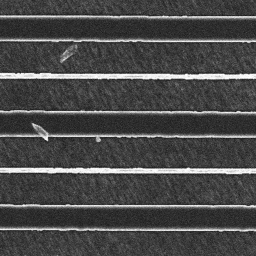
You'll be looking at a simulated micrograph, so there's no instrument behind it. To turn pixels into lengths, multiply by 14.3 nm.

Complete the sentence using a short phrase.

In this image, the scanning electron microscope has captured lines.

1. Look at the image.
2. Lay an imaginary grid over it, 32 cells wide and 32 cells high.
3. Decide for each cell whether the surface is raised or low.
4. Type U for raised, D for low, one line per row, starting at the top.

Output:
DDDDDDDDDDDDDDDDDDDDDDDDDDDDDDDD
DDDDDDDDDDDDDDDDDDDDDDDDDDDDDDDD
UUUUUUUUUUUUUUUUUUUUUUUUUUUUUUUU
UUUUUUUUUUUUUUUUUUUUUUUUUUUUUUUU
UUUUUUUUUUUUUUUUUUUUUUUUUUUUUUUU
DDDDDDDDDDDDDDDDDDDDDDDDDDDDDDDD
DDDDDDDDDDDDDDDDDDDDDDDDDDDDDDDD
DDDDDDDDDDDDDDDDDDDDDDDDDDDDDDDD
DDDDDDDDDDDDDDDDDDDDDDDDDDDDDDDD
DDDDDDDDDDDDDDDDDDDDDDDDDDDDDDDD
DDDDDDDDDDDDDDDDDDDDDDDDDDDDDDDD
DDDDDDDDDDDDDDDDDDDDDDDDDDDDDDDD
DDDDDDDDDDDDDDDDDDDDDDDDDDDDDDDD
DDDDDDDDDDDDDDDDDDDDDDDDDDDDDDDD
UUUUUUUUUUUUUUUUUUUUUUUUUUUUUUUU
UUUUUUUUUUUUUUUUUUUUUUUUUUUUUUUU
UUUUUUUUUUUUUUUUUUUUUUUUUUUUUUUU
DDDDDDDDDDDDDDDDDDDDDDDDDDDDDDDD
DDDDDDDDDDDDDDDDDDDDDDDDDDDDDDDD
DDDDDDDDDDDDDDDDDDDDDDDDDDDDDDDD
DDDDDDDDDDDDDDDDDDDDDDDDDDDDDDDD
DDDDDDDDDDDDDDDDDDDDDDDDDDDDDDDD
DDDDDDDDDDDDDDDDDDDDDDDDDDDDDDDD
DDDDDDDDDDDDDDDDDDDDDDDDDDDDDDDD
DDDDDDDDDDDDDDDDDDDDDDDDDDDDDDDD
DDDDDDDDDDDDDDDDDDDDDDDDDDDDDDDD
UUUUUUUUUUUUUUUUUUUUUUUUUUUUUUUU
UUUUUUUUUUUUUUUUUUUUUUUUUUUUUUUU
UUUUUUUUUUUUUUUUUUUUUUUUUUUUUUUU
DDDDDDDDDDDDDDDDDDDDDDDDDDDDDDDD
DDDDDDDDDDDDDDDDDDDDDDDDDDDDDDDD
DDDDDDDDDDDDDDDDDDDDDDDDDDDDDDDD